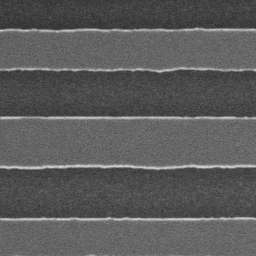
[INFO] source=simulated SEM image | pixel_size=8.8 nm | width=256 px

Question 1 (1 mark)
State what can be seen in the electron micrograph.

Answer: lines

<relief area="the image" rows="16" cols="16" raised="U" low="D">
DDDDDDDDDDDDDDDD
DDDDDDDDDDDDDDDD
UUUUUUUUUUUUUUUU
UUUUUUUUUUUUUUUU
DDDDDDDDDDDDDDDD
DDDDDDDDDDDDDDDD
DDDDDDDDDDDDDDDD
UUUUUUUUUUUUUUUU
UUUUUUUUUUUUUUUU
UUUUUUUUUUUUUUUU
DUUDDDDDDUUDDDDD
DDDDDDDDDDDDDDDD
DDDDDDDDDDDDDDDD
DDDDDDDDDDDDDDDD
UUUUUUUUUUUUUUUU
UUUUUUUUUUUUUUUU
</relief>